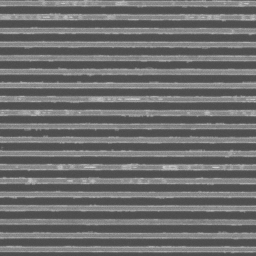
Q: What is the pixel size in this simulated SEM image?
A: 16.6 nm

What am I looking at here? parallel lines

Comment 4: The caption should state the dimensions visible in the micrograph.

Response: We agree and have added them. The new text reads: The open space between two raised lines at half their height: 70.6 nanometres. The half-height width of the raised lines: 158 nm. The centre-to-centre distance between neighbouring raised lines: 0.227 µm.